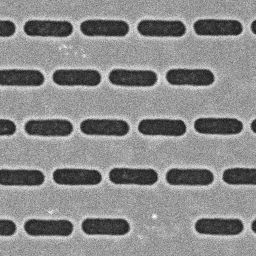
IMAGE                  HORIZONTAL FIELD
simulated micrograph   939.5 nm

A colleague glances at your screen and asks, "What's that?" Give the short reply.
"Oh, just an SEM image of a regular array of holes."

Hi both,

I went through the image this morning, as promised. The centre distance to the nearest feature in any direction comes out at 56.2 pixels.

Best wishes